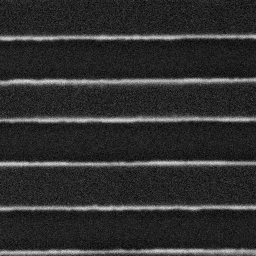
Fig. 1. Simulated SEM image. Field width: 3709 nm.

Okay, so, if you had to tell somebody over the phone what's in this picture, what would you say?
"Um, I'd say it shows lines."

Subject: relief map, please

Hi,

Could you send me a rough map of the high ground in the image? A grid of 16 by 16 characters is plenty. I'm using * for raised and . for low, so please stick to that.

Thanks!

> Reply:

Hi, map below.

****************
****************
................
................
................
****************
****************
***.............
................
................
****************
****************
****************
................
................
................